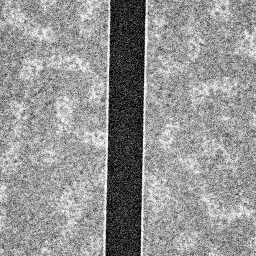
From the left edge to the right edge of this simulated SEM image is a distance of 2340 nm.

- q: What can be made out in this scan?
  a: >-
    one or a few lines or trenches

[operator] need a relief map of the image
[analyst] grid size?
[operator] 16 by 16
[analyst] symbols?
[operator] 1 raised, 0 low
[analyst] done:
1111111001111111
1111111001111111
1111111001111111
1111111001111111
1111111001111111
1111111001111111
1111111001111111
1111111001111111
1111111001111111
1111111001111111
1111111001111111
1111111001111111
1111111001111111
1111111001111111
1111111001111111
1111111001111111